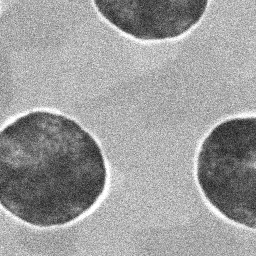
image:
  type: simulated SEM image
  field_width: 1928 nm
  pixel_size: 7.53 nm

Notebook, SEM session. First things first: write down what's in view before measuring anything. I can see holes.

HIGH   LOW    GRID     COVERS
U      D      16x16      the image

UUUUUUDDDDDDDUUU
UUUUUUUDDDDDUUUU
UUUUUUUUUDUUUUUU
UUUUUUUUUUUUUUUU
UUUUUUUUUUUUUUUU
UUUUUUUUUUUUUUUU
UUUUUUUUUUUUUUUU
UDDDUUUUUUUUUUDD
DDDDDDUUUUUUUDDD
DDDDDDUUUUUUDDDD
DDDDDDDUUUUUDDDD
DDDDDDDUUUUUDDDD
DDDDDDUUUUUUUDDD
UDDDDUUUUUUUUUDD
UUUUUUUUUUUUUUUU
UUUUUUUUUUUUUUUU